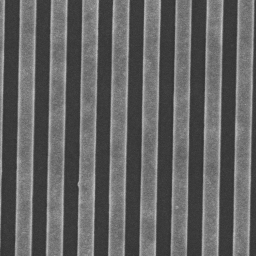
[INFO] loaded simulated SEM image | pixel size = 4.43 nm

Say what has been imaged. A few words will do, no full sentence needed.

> parallel lines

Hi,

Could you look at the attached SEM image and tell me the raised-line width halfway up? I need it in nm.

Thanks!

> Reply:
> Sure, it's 70.8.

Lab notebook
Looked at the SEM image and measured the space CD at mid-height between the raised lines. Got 66.4 nanometres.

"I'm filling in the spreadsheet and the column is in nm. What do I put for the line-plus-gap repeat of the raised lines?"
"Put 138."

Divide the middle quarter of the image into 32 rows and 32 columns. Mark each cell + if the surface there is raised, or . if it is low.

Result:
....++++....++++....++++....++++
....++++....++++....++++....++++
....++++....++++....++++....++++
....++++....++++....++++....+++.
....++++....++++....++++....+++.
....++++....++++....+++.....+++.
....++++....++++....+++.....+++.
....++++....++++....++++....+++.
....++++....++++....++++....+++.
....++++....++++....++++....+++.
....++++....++++....++++....+++.
....++++....++++....++++....+++.
....++++....++++....+++.....+++.
....++++....++++....+++.....+++.
....++++....++++....+++.....+++.
....++++....++++....+++.....+++.
....++++....++++....+++....++++.
....++++....++++....+++....++++.
....++++....+++.....+++....++++.
....++++....+++.....+++....++++.
....++++....+++.....+++....++++.
....++++....+++.....+++....++++.
....++++....+++.....+++....++++.
....++++....+++.....+++....++++.
....++++....+++.....+++....++++.
....++++....+++.....+++....++++.
....++++....+++.....+++....++++.
....++++....+++.....+++....++++.
....++++....+++.....+++....++++.
....++++....+++....++++....++++.
....++++....+++....++++....++++.
....+++....++++....++++....++++.